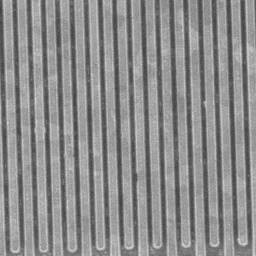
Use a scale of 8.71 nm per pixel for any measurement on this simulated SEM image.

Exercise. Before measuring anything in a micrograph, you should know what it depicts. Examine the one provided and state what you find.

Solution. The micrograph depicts parallel lines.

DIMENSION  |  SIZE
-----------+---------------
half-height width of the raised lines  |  75.1 nm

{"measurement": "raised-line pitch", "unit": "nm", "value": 124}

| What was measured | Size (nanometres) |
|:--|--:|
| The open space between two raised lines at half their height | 45.7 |